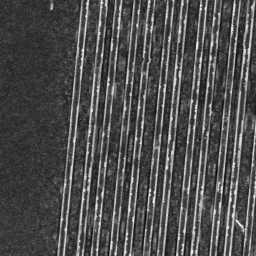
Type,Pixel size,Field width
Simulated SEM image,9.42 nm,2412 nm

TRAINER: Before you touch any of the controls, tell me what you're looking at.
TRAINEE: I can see parallel lines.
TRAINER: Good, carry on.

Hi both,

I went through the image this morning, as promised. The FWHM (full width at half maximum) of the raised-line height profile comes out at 64.4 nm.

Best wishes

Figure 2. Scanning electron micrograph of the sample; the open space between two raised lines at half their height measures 110 nm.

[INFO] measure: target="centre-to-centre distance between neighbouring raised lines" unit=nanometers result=156